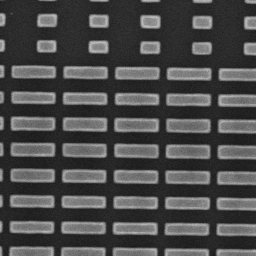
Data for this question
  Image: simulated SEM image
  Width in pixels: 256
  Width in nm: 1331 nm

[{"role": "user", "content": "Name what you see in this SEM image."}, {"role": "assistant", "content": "wiring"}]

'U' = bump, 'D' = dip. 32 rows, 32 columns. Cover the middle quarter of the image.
DDDDDDDDDDDDDDDDDDDDDDDDDDDDDDDD
UUUUUUUUUUUDDUUUUUUUUUUUDDUUUUUU
UUUUUUUUUUUDDUUUUUUUUUUUDDUUUUUU
DDDDDUUUUUDDDUUUUUUUUUUDDDUUUUUU
DDDDDDDDDDDDDDDDDDDDDDDDDDDDDDDD
DDDDDDDDDDDDDDDDDDDDDDDDDDDDDDDD
DDDDDDDDDDDDDDDDDDDDDDDDDDDDDDDD
UUUUUUUUUUDDDDDDUUDDDDDDDDDDDDDD
UUUUUUUUUUDDDUUUUUUUUUUDDDUUUUUU
UUUUUUUUUUDDDUUUUUUUUUUDDDUUUUUU
DDDDDDDDDDDDDDDDDDDDDDDDDDDDDDDD
DDDDDDDDDDDDDDDDDDDDDDDDDDDDDDDD
DDDDDDDDDDDDDDDDDDDDDDDDDDDDDDDD
DDDDDDDDDDDDDDDDDDDDDDDDDDDDDDDD
UUUUUUUUUUDDDUUUUUUUUUUDDDUUUUUU
UUUUUUUUUUDDDUUUUUUUUUUDDDUUUUUU
DUUUUUUUUUDDDUUUUUUUUUUDDDUUUUUU
DDDDDDDDDDDDDDDDDDDDDDDDDDDDDDDD
DDDDDDDDDDDDDDDDDDDDDDDDDDDDDDDD
DDDDDDDDDDDDDDDDDDDDDDDDDDDDDDDD
UUUUUUUUUUDDDUUUUUUUUUUDDDUUUUUU
UUUUUUUUUUDDDUUUUUUUUUUDDDUUUUUU
UUUUUUUUUUDDDUUUUUUUUUUDDDUUUUUU
DDDDDDDDDDDDDDDDDDDDDDDDDDDDDDDD
DDDDDDDDDDDDDDDDDDDDDDDDDDDDDDDD
DDDDDDDDDDDDDDDDDDDDDDDDDDDDDDDD
DDDDDDDDDDDDDDDDDDDDDDDDDDDDDDDD
UUUUUUUUUUDDDUUUUUUUUUUDDDUUUUUU
UUUUUUUUUUDDDUUUUUUUUUUDDDUUUUUU
DDDDDDDDUUDDDUUUUUUUUUUDDDUUUUUU
DDDDDDDDDDDDDDDDDDDDDDDDDDDDDDDD
DDDDDDDDDDDDDDDDDDDDDDDDDDDDDDDD